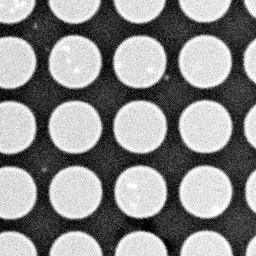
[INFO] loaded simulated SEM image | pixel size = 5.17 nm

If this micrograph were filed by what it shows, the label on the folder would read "an array of small figures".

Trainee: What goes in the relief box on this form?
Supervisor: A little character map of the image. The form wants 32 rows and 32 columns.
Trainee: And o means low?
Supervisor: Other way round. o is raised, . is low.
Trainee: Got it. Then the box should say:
oooo..oooooo..oooooo...oooooo..o
oooo...ooooo...ooooo...ooooo...o
ooo.....ooo.....ooo.....ooo.....
................................
................................
ooo....ooooo...ooooo...ooooo...o
oooo...ooooo...ooooo...oooooo..o
oooo..ooooooo.ooooooo.ooooooo..o
oooo..oooooo..ooooooo..oooooo..o
oooo...ooooo...ooooo...ooooo...o
ooo.....ooo.....ooo.....ooo.....
................................
................................
ooo....ooooo...ooooo....oooo....
oooo...ooooo...ooooo...oooooo..o
oooo..ooooooo.ooooooo..oooooo..o
oooo..ooooooo.ooooooo..oooooo..o
oooo...ooooo...ooooo...ooooo...o
ooo.....ooo.....ooo.....oooo....
................................
................................
ooo.....ooo.....ooo.....oooo....
oooo...ooooo...ooooo...oooooo..o
oooo..ooooooo..oooooo..oooooo..o
oooo..ooooooo.ooooooo..oooooo..o
oooo...ooooo...ooooo...ooooo...o
ooo....oooo.....oooo....oooo....
................................
................................
ooo.....ooo.....ooo.....oooo....
oooo...ooooo...ooooo...ooooo...o
oooo..ooooooo..oooooo..oooooo..o